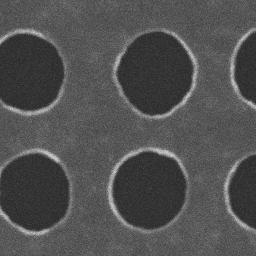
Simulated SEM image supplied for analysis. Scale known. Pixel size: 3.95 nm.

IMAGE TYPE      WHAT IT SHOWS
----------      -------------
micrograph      holes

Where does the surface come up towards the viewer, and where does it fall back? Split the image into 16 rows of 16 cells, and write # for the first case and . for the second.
################
################
...#####...####.
....####....###.
....###.....###.
....####....###.
...#####...#####
################
################
################
....###....####.
....###.....##..
....###.....##..
....####...####.
################
################